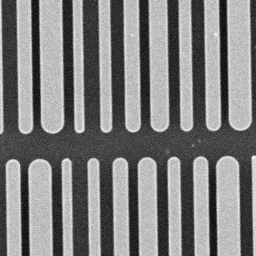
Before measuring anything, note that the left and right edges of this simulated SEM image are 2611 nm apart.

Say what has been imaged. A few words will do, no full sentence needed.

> groups of lines, slits or small figures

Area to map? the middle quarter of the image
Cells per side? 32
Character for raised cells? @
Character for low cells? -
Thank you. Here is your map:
---@@----@@@---@@@@---@@@@---@@@
---@@----@@@---@@@@---@@@@---@@@
---@@----@@@---@@@@---@@@@---@@@
---@@----@@@---@@@@---@@@@---@@@
---@@----@@@---@@@@---@@@@---@@@
---@@----@@@---@@@@---@@@@---@@@
---@@----@@@---@@@@---@@@@---@@@
---@@----@@@---@@@@---@@@@---@@@
---@@----@@@---@@@@---@@@@---@@@
---@@----@@@---@@@@---@@@@---@@@
---@@----@@@---@@@@---@@@@---@@@
---@@----@@@---@@@@---@@@@---@@@
---@@----@@@---@@@@---@@@@---@@@
---@@----@@@---@@@@---@@@@---@@@
---@@----@@@---@@@@---@@@@---@@@
---@@----@@@----@@@---@@@@---@@@
---@@----@@@----@@@----@@-----@@
--------------------------------
--------------------------------
--------------------------------
--------------------------------
--------------------------------
--------------------------------
--------------------@@-----@----
@@----@@@---@@@@---@@@@---@@@---
@@----@@@---@@@@---@@@@---@@@---
@@----@@@---@@@@---@@@@---@@@---
@@----@@@---@@@@---@@@@---@@@---
@@----@@@---@@@@---@@@@---@@@---
@@----@@@---@@@@---@@@@---@@@---
@@----@@@---@@@@---@@@@---@@@---
@@----@@@---@@@@---@@@@---@@@---